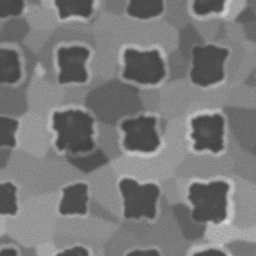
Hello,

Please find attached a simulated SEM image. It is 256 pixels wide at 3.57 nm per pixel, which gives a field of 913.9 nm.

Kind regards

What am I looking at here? a regular array of holes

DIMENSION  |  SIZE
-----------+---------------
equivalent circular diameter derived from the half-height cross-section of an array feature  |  148 nanometres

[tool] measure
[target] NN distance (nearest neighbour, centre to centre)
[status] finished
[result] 232 nanometres